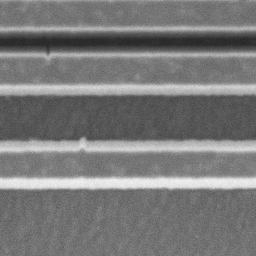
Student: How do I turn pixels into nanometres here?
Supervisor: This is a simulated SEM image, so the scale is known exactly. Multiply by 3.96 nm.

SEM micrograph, one or a few lines or trenches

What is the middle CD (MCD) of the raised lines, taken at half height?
154 nanometres